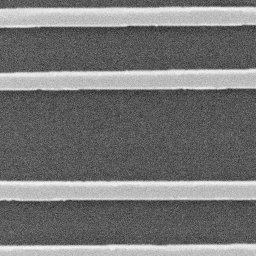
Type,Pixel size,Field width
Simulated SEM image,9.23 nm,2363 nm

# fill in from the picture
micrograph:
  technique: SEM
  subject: lines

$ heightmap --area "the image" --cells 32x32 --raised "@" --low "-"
--------------------------------
@@@@@@@@@@@@@@@@@@@@@@@@@@@@@@@@
@@@@@@@@@@@@@@@@@@@@@@@@@@@@@@@@
--------------------------------
--------------------------------
--------------------------------
--------------------------------
--------------------------------
--------------------------------
@@@@@@@@@@@@@@@@@@@@@@@@@@@@@@@@
@@@@@@@@@@@@@@@@@@@@@@@@@@@@@@@@
--------------------------------
--------------------------------
--------------------------------
--------------------------------
--------------------------------
--------------------------------
--------------------------------
--------------------------------
--------------------------------
--------------------------------
--------------------------------
--------------------------------
@@@@@@@@@@@@@@@@@@@@@@@@@@@@@@@@
@@@@@@@@@@@@@@@@@@@@@@@@@@@@@@@@
--------------------------------
--------------------------------
--------------------------------
--------------------------------
--------------------------------
--------------------------------
@@@@@@@@@@@@@@@@@@@@@@@@@@@@@@@@